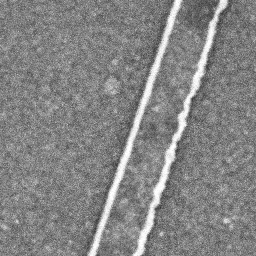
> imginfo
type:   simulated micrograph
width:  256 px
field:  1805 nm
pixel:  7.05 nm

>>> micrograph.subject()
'one or a few lines or trenches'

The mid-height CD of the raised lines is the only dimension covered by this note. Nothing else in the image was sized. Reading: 299 nanometres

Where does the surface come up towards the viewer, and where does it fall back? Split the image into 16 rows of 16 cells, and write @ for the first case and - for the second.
-----------@@@--
-----------@@---
----------@@@---
----------@@@---
----------@@----
---------@@@----
---------@@@----
---------@@-----
--------@@@-----
--------@@@-----
--------@@------
-------@@@------
-------@@@------
-------@@-------
------@@@-------
------@@@-------